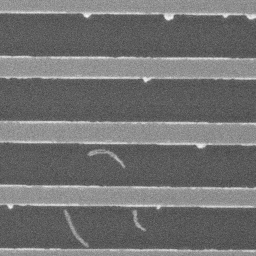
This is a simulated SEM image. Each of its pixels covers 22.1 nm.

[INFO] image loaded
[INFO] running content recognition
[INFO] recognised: lines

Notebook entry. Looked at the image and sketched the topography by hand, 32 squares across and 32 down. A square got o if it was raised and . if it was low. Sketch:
oooooooooooooooooooooooooooooooo
..oooooooooooooooooooooooooooooo
................................
................................
................................
................................
................................
oooooooooooooooooooooooooooooooo
oooooooooooooooooooooooooooooooo
oooooooooooooooooooooooooooooooo
................................
................................
................................
................................
................................
oooooooooooooooooooooooooooooooo
oooooooooooooooooooooooooooooooo
oooooooooooooooooooooooooooooooo
................................
................................
................................
................................
................................
oooooooooooooooooooo.o..........
oooooooooooooooooooooooooooooooo
oooooooooooooooooooooooooooooooo
................................
................................
................................
................................
................................
oooooooooooooooooooooooooooooooo